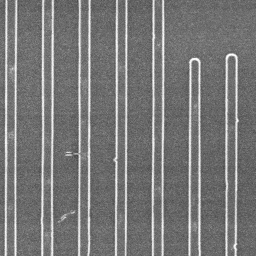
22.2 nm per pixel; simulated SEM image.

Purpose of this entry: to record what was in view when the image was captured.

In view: parallel lines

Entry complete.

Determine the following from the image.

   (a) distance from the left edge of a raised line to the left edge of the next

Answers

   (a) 818 nanometers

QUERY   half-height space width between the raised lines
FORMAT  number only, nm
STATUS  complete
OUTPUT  595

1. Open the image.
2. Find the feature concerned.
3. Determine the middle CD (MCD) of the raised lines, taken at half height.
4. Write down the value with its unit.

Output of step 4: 217 nm